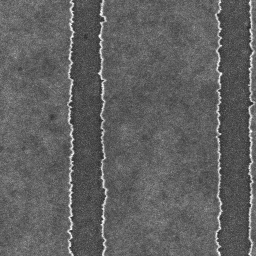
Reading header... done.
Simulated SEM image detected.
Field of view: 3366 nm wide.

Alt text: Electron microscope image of one or a few lines or trenches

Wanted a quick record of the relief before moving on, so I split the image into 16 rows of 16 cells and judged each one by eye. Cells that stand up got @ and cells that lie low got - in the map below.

@@@@--@@@@@@@@--
@@@@--@@@@@@@@--
@@@@--@@@@@@@@--
@@@@--@@@@@@@@--
@@@@--@@@@@@@@--
@@@@--@@@@@@@@--
@@@@--@@@@@@@@--
@@@@--@@@@@@@@--
@@@@--@@@@@@@@--
@@@@@-@@@@@@@@--
@@@@--@@@@@@@@--
@@@@--@@@@@@@@--
@@@@---@@@@@@@--
@@@@--@@@@@@@@--
@@@@--@@@@@@@@--
@@@@---@@@@@@@--